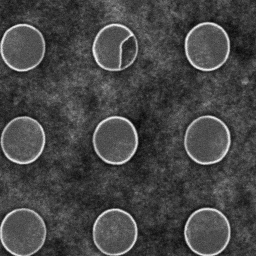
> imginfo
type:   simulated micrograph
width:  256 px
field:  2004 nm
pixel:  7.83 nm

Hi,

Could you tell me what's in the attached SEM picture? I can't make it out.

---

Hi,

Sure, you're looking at raised bodies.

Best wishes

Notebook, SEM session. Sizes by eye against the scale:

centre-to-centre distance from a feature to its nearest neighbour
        718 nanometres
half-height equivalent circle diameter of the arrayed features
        357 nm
